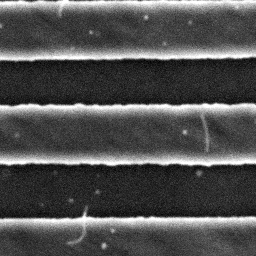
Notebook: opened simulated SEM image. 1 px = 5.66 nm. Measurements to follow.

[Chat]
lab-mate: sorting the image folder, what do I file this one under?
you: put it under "lines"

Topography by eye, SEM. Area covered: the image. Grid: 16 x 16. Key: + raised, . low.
++++++++++++++++
++++++++++++++++
++++++++++++++++
++++++++++++++++
................
................
................
++++++++++++++++
++++++++++++++++
++++++++++++++++
................
................
................
................
++++++++++++++++
++++++++++++++++